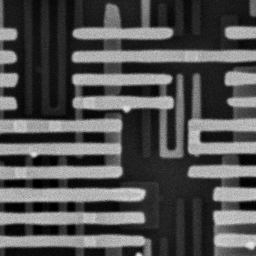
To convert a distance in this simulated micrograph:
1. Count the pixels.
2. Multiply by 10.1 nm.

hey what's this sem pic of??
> wiring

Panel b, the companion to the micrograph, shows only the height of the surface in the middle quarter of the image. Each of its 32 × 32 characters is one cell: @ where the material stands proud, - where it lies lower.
--------------------------------
--------------------------------
--------------------------------
--@@@@@@@@@@@@@@@@@@@@@@@@@-----
--@@@@@@@@@@@@@@@@@@@@@@@@@-----
--------------------------------
--------------------------------
--------------------------------
---@@@@@@@@@@@@@@@@@@@@@@@@-----
--@@@@@@@@@@@@@@@@@@@@@@@@@-----
--@@@@@@@@@@@@@@@@@@@@@@@@@-----
---------------@----------------
--------------------------------
--------------------------------
@@@@@@@@@@@@@@-----------------@
@@@@@@@@@@@@@@-----------------@
@@@@@@@@@@@@@@-----------------@
-------------------------------@
-------------------------------@
-------------------------------@
@@@@@@@@@@@@@@-----------------@
@@@@@@@@@@@@@@-----------------@
@@@@@@@@@@----------------------
--------------------------------
--------------------------------
--------------------------------
@@@@@@@@@@@@@@-----------------@
@@@@@@@@@@@@@@-----------------@
--------------------------------
--------------------------------
--------------------------------
@@@@@@@@@@@@@@@@@@@@------------